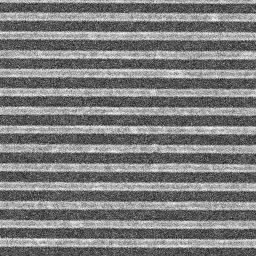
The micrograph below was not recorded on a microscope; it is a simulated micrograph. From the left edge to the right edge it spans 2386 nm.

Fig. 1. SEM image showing parallel lines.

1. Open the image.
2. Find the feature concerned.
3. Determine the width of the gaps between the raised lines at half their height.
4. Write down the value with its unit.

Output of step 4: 112 nanometers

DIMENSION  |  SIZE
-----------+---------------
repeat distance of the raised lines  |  0.175 um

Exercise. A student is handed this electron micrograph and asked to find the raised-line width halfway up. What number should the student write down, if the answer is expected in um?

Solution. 0.0641